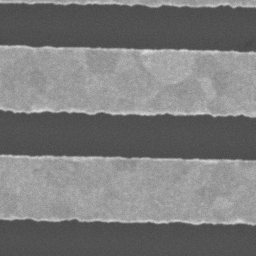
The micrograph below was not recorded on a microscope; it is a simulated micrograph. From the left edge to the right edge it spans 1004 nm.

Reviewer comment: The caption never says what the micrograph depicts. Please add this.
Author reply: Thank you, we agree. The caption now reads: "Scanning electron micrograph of lines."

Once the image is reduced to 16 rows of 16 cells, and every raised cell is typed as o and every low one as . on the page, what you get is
................
................
................
oooooooooooooooo
oooooooooooooooo
oooooooooooooooo
oooooooooooooooo
................
................
................
oooooooooooooooo
oooooooooooooooo
oooooooooooooooo
oooooooooooooooo
................
................